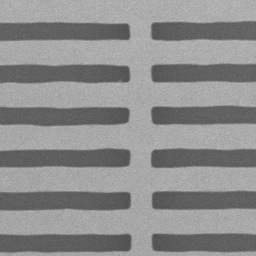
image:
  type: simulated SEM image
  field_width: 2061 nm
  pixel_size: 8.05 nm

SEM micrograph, groups of lines, slits or small figures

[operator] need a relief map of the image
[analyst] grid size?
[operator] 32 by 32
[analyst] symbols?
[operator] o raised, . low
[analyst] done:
oooooooooooooooooooooooooooooooo
oooooooooooooooooooooooooooooooo
oooooooooooooooooooooooooooooooo
................ooo.............
................ooo.............
oooooooooooooooooooooooooooooooo
oooooooooooooooooooooooooooooooo
oooooooooooooooooooooooooooooooo
................ooo.............
................ooo.............
ooo..oooooo.oooooooooooooooooooo
oooooooooooooooooooooooooooooooo
oooooooooooooooooooooooooooooooo
................ooo.............
................ooo.............
...............oooo.............
oooooooooooooooooooooooooooooooo
oooooooooooooooooooooooooooooooo
oooooooooooooooooooooooooooooooo
................ooo.............
................ooo.............
oooooooooooooooooooooooooooooooo
oooooooooooooooooooooooooooooooo
oooooooooooooooooooooooooooooooo
................ooo.............
................ooo.............
oooooooooooooooooooooooooooooooo
oooooooooooooooooooooooooooooooo
oooooooooooooooooooooooooooooooo
................ooo.............
................ooo.............
.............oooooooo..oooo....o